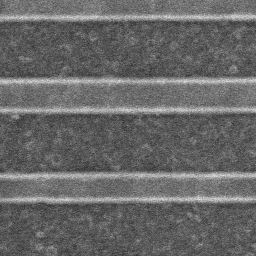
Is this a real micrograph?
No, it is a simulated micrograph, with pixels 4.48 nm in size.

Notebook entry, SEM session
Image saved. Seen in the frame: one or a few lines or trenches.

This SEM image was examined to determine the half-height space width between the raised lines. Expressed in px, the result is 64.8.